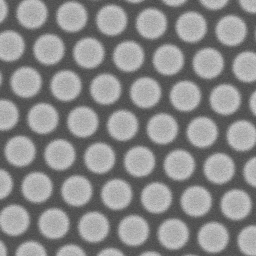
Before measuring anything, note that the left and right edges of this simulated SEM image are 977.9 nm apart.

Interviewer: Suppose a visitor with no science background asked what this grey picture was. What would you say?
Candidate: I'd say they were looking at an array of small figures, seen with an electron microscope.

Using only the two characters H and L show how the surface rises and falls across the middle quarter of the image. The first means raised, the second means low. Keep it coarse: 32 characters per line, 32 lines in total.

LLLLHHHHLLLLLHHHHHHLLLLHHHHHHLLL
LLLLLLLLLLLLLLLHHHLLLLLHHHHHHLLL
HHHLLLLLLLLLLLLLLLLLLLLLLHHLLLLL
HHHHLLLLHHHHHLLLLLLLLLLLLLLLLLLL
HHHHLLLHHHHHHHLLLLHHHHHLLLLLLHHL
HHHHLLLHHHHHHHLLLHHHHHHHLLLLHHHH
HHHHLLLHHHHHHHLLLHHHHHHHLLLHHHHH
HHHLLLLHHHHHHHLLLHHHHHHHLLLHHHHH
HHLLLLLLHHHHHLLLLHHHHHHHLLLHHHHH
LLLLLLLLLHHHLLLLLHHHHHHLLLLHHHHH
LLLLLLLLLLLLLLLLLLLHHHLLLLLLHHHH
LLLHHHHLLLLLLLLLLLLLLLLLLLLLLHHL
LLHHHHHHLLLLHHHHHLLLLLLLLLLLLLLL
LHHHHHHHLLLHHHHHHHLLLLHHHHHLLLLL
LHHHHHHHLLLHHHHHHHLLLHHHHHHHLLLL
LHHHHHHHLLLHHHHHHHLLLHHHHHHHLLLH
LLHHHHHHLLLHHHHHHHLLLHHHHHHHLLLH
LLLHHHHLLLLLHHHHHHLLLHHHHHHHLLLH
LLLLLLLLLLLLLHHHHLLLLLHHHHHLLLLH
HLLLLLLLLLLLLLLLLLLLLLLHHHLLLLLL
HHLLLLLHHHHLLLLLLLLLLLLLLLLLLLLL
HHLLLLHHHHHHLLLLLHHHHLLLLLLLLLLL
HHHLLHHHHHHHLLLLHHHHHHLLLLHHHHHL
HHHLLHHHHHHHLLLHHHHHHHLLLLHHHHHH
HHLLLHHHHHHHLLLHHHHHHHHLLHHHHHHH
HLLLLLHHHHHHLLLHHHHHHHLLLHHHHHHH
LLLLLLLHHHHLLLLLHHHHHHLLLHHHHHHH
LLLLLLLLLLLLLLLLLHHHHLLLLLHHHHHH
LHHHHLLLLLLLLLLLLLLLLLLLLLLHHHHL
HHHHHHLLLLLHHHHLLLLLLLLLLLLLLLLL
HHHHHHHLLLHHHHHHLLLLLHHHHLLLLLLL
HHHHHHHLLLHHHHHHHLLLHHHHHHLLLLLH